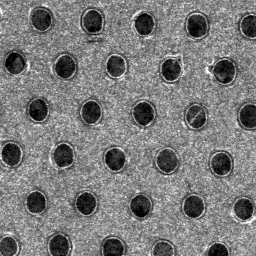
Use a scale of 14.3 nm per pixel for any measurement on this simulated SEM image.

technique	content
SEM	a regular array of raised bodies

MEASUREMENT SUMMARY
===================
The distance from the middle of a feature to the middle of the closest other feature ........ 439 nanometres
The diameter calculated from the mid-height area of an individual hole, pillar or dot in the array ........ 323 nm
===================